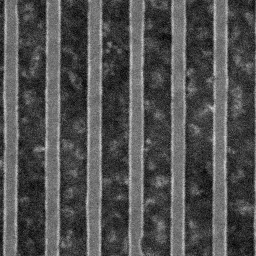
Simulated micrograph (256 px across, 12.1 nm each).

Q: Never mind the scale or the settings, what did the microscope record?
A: parallel lines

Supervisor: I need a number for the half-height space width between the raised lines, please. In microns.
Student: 0.351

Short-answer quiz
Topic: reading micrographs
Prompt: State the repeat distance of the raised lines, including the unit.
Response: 505 nanometres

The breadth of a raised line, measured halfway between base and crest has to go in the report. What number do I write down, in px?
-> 12.4